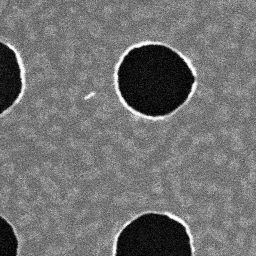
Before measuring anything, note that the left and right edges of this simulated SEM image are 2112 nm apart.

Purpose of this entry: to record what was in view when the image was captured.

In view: holes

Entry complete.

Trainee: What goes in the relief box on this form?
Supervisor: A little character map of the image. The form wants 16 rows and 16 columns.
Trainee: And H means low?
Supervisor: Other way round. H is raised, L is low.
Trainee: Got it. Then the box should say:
HHHHHHHHHHHHHHHH
HHHHHHHHHHHHHHHH
HHHHHHHHHHHHHHHH
LHHHHHHHLLLHHHHH
LHHHHHHLLLLLHHHH
LHHHHHHLLLLLHHHH
LHHHHHHHLLLHHHHH
HHHHHHHHHHHHHHHH
HHHHHHHHHHHHHHHH
HHHHHHHHHHHHHHHH
HHHHHHHHHHHHHHHH
HHHHHHHHHHHHHHHH
HHHHHHHHHHHHHHHH
HHHHHHHHHLHHHHHH
LHHHHHHHLLLLHHHH
LHHHHHHLLLLLHHHH